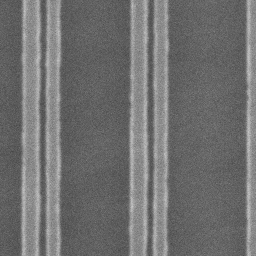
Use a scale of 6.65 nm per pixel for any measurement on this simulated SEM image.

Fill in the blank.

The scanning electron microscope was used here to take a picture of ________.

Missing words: lines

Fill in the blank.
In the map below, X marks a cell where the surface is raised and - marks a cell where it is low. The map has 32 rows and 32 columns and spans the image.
---XXXX---------XXXXX----------X
---XXXX---------XXXXX----------X
---XXXX---------XXXXX----------X
---XXXX---------XXXXX----------X
---XXXX---------XXXXX----------X
---XXXX---------XXXXX----------X
---XXXX---------XXXXX----------X
---XXXX---------XXXXX----------X
---XXXX---------XXXXX----------X
---XXXX---------XXXXX----------X
---XXXX---------XXXXX----------X
---XXXX---------XXXXX----------X
---XXXX---------XXXXX----------X
---XXXX---------XXXXX----------X
---XXXX---------XXXXX----------X
---XXXX---------XXXXX----------X
---XXXX---------XXXXX----------X
---XXXX---------XXXXX----------X
---XXXX---------XXXXX----------X
---XXXX---------XXXXX----------X
---XXXX---------XXXXX----------X
---XXXX---------XXXXX----------X
---XXXX---------XXXXX----------X
---XXXX---------XXXXX----------X
---XXXX---------XXXXX----------X
---XXXX---------XXXXX----------X
---XXXX---------XXXXX----------X
---XXXX---------XXXXX----------X
---XXXX---------XXXXX----------X
---XXXX---------XXXXX----------X
---XXXX---------XXXXX----------X
---XXXX---------XXXXX----------X